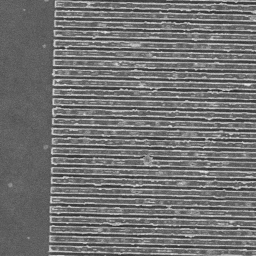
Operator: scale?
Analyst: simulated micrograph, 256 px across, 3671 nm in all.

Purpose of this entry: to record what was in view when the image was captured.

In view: parallel lines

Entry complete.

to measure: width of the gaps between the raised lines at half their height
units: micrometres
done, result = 0.0502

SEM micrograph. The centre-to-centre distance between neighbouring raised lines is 140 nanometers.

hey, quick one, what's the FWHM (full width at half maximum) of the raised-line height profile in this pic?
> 0.086 microns